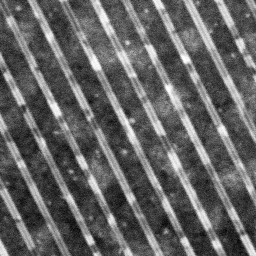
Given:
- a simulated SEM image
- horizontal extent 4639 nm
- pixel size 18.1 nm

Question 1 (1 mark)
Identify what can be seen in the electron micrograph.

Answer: parallel lines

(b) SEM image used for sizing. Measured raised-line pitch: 504 nanometers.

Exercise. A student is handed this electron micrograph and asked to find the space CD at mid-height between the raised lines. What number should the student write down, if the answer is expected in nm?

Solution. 429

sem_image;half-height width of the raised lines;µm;0.0851